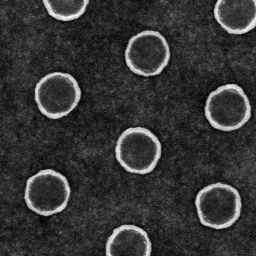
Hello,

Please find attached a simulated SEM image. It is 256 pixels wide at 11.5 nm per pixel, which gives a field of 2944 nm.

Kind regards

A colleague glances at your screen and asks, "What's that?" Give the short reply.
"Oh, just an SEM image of raised bodies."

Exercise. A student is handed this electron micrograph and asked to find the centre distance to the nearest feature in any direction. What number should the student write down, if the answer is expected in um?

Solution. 1.12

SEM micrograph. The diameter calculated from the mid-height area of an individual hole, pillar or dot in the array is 0.49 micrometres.